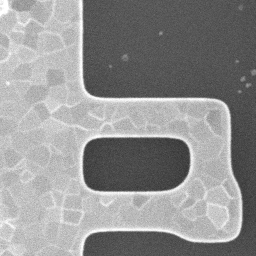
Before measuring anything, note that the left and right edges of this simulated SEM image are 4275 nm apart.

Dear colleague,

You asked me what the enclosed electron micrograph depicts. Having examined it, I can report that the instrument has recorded wiring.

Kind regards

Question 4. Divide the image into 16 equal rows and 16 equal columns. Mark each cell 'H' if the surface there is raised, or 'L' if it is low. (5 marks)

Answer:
HHHHHLLLLLLLLLLL
HHHHHLLLLLLLLLLL
HHHHHLLLLLLLLLLL
HHHHHLLLLLLLLLLL
HHHHHLLLLLLLLLLL
HHHHHLLLLLLLLLLL
HHHHHHHHHHHHHHLL
HHHHHHHHHHHHHHLL
HHHHHHHHHHHHHHLL
HHHHHLLLLLLLHHLL
HHHHHLLLLLLLHHLL
HHHHHLLLLLLHHHHL
HHHHHHHHHHHHHHHL
HHHHHHHHHHHHHHHL
HHHHHHLLLLHHHHHL
HHHHHLLLLLLLLLLL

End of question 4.